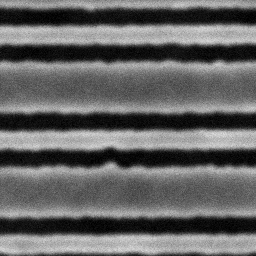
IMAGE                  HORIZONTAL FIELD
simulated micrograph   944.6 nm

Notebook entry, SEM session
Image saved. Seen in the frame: lines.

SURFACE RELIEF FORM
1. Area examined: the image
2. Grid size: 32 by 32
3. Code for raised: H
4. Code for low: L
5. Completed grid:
HHHHHHHHHHHHHHHHHHHHHHHHHHHHHHHH
LLLLLLLLLLLLLLLLLLLLLLLLLLLLLLLL
LLLLLLLLLLLLLLLLLLLLLLLLLLLLLLLL
HHHHHHHHHHHHHHHHHHHHHHHHHHHHHHHH
HHHHHHHHHHHHHHHHHHHHHHHHHHHHHHHH
LLLLLLLLLLLLLLLHLLLLLLLLLLLLHLLL
LLLLLLLLLLLLLLLLLLLLLLLLLLLLLLLL
LLLLLLLLLLLLLLLLLLLLLLLLLLLLLLLL
HHHHHHHHHHHHHHHHHHHHHHHHHHHHHHHH
HHHHHHHHHHHHHHHHHHHHHHHHHHHHHHHH
HHHHHHHHHHHHHHHHHHHHHHHHHHHHHHHH
HHHHHHHHHHHHHHHHHHHHHHHHHHHHHHHH
HHHHHHHHHHHHHHHHHHHHHHHHHHHHHHHH
HHHHHHHHHHHHHHHHHHHHHHHHHHHHHHHH
LLLLLLLLLLLLLLLLLLLLLLLLLLLLLLLL
LLLLLLLLLLLLLLLLLLLLLLLLLLLLLLLL
LLHHHHHHHHHHHHHHHHHHHHHHHHHHHHHH
HHHHHHHHHHHHHHHHHHHHHHHHHHHHHHHH
HHHHHHHHHHHHHLHHHHHHHHHHHHHHHHHH
LLLLLLLLLLLLLLLLLLLLLLLLLLLLLLLL
LLLLLLLLLLLLLLLLLLLLLLLLLLLLLLLL
HHHHHHHHHHHHHHHHHHHHHHHHHHHHHHHH
HHHHHHHHHHHHHHHHHHHHHHHHHHHHHHHH
HHHHHHHHHHHHHHHHHHHHHHHHHHHHHHHH
HHHHHHHHHHHHHHHHHHHHHHHHHHHHHHHH
HHHHHHHHHHHHHHHHHHHHHHHHHHHHHHHH
HHHHHHHHHHHHHHHHHHHHHHHHHHHHHHHH
LLLLLLLLLLLLLLLLLLLLLLLLLLLLLLLL
LLLLLLLLLLLLLLLLLLLLLLLLLLLLLLLL
LHHLLLLHHHLLLLHHHHHLHHHHHHHHHHHH
HHHHHHHHHHHHHHHHHHHHHHHHHHHHHHHH
HHHHHHHHLHHHHHHHLHHHHHHHLHHHHHHL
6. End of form